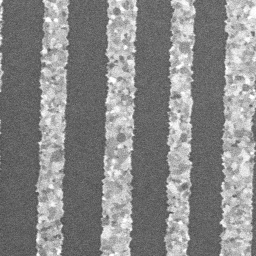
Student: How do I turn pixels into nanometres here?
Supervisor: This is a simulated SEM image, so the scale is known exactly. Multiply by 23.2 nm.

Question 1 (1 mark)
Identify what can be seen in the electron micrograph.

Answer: one or a few lines or trenches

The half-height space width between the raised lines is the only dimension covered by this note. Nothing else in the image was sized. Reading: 888 nanometers